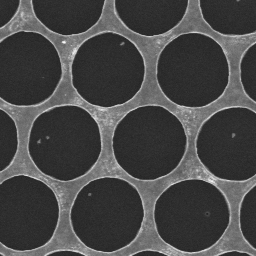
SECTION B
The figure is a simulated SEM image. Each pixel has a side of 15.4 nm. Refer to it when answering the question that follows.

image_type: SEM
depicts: holes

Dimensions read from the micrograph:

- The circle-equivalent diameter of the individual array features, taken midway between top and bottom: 1140 nm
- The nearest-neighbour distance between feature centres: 1280 nm